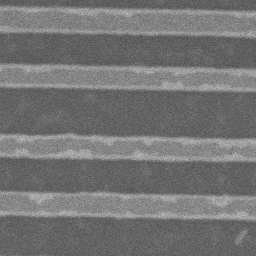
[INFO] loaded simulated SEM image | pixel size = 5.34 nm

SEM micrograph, one or a few lines or trenches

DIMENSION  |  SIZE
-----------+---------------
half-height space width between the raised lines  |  204 nanometres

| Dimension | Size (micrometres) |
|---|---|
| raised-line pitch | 0.327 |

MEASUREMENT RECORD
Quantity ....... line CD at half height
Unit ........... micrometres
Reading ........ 0.102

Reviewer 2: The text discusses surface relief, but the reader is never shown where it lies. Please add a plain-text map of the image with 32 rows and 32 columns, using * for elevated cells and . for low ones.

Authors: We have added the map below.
................................
********************..**........
********************************
********************************
................................
................................
................................
................................
*********.......................
********************************
********************************
................................
................................
................................
................................
................................
................................
***********************.........
********************************
....***..***********************
................................
................................
................................
................................
***************..*.*............
********************************
********************************
................................
................................
................................
................................
................................